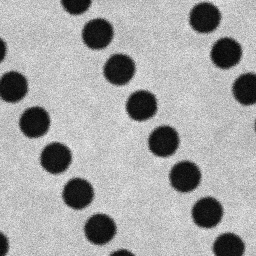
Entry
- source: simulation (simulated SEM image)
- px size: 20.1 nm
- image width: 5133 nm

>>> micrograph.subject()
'a regular array of holes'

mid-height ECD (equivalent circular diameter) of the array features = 659 nm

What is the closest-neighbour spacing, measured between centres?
833 nm